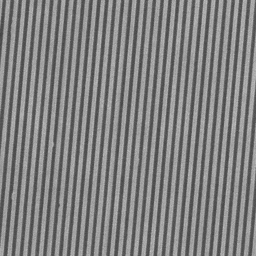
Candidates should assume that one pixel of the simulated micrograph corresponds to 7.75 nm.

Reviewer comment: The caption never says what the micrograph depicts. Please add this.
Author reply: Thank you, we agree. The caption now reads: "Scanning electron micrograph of parallel lines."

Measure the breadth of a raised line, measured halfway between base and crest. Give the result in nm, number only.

28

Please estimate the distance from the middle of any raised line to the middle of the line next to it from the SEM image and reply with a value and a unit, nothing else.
60.9 nm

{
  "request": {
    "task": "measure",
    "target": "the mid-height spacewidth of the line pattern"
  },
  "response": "34.7 nm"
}